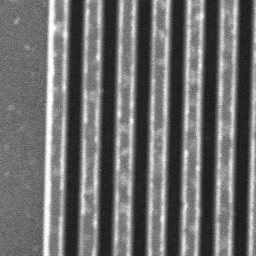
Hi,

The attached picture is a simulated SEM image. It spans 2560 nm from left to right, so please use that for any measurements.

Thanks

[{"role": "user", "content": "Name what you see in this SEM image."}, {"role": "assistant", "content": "parallel lines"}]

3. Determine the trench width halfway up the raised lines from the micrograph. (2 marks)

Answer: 168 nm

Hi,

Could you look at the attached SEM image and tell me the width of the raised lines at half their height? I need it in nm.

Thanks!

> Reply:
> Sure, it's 168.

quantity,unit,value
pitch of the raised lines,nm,338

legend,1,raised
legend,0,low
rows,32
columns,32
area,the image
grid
00000001100110011001100110001100
00000001000110011001100110001100
00000011000110011001100110001100
00000011000110011001100110001100
00000011000110011001100110011100
00000011000110011001100110011100
00000011000110011001100110011000
00000011000110011001100110011000
00000011000110011001100110011000
00000011000100011001100110011000
00000011001100011001100110011000
00000011001110011001100110011000
00000011001100011001100110011000
00000011001100011001100110011001
00000011001100011001100110011001
00000011001100011001100110011001
00000011001100011001100110011001
00000011001100011001100110011001
00000011001100011001100110011001
00000011001100011001100110011001
00000011001100011001100110011001
00000011001100010001100110011001
00000011001100010001100110011001
00000011001100110001100110011001
00000011001100110001100110011001
00000011001100110001100110011001
00000011001100110001100110011001
00000011001100110001100110011001
00000011001100110001100110011001
00000011001100110001100110011001
00000011001100110001100110011001
00000011001100110011000110011001